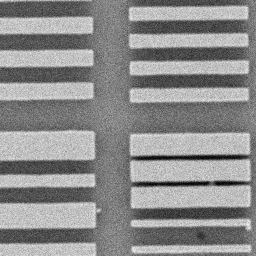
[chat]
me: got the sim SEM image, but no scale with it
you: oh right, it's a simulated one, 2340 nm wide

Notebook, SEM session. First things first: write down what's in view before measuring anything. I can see groups of lines, slits or small figures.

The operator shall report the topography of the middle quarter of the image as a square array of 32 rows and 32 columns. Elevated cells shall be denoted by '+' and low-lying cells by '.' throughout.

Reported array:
.................+++++++++++++++
.................+++++++++++++++
.................+++++..........
................................
................................
+++++++.........................
+++++++..........+++++++++++++++
+++++++..........+++++++++++++++
++++++...........+++++++++++++++
................................
................................
................................
................................
................................
................................
................................
................................
+++++++......................+++
+++++++..........+++++++++++++++
+++++++..........+++++++++++++++
+++++++..........+++++++++++++++
+++++++..........+++++++++++++++
+++++++..........+++++++++++++++
+++++++.........................
.................+++++++++++++++
.................+++++++++++++++
.................+++++++++++++++
.................+++++++++++++++
+++++++..........+++++++++++++++
+++++++.........................
++++............................
.................+++++++++++++++